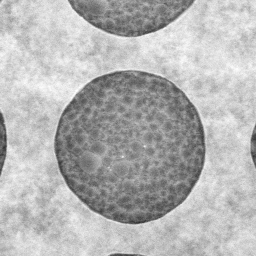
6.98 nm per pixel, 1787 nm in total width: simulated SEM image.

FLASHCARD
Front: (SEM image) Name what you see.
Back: holes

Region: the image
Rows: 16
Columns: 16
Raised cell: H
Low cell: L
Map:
HHHHHLLLLLLLHHHH
HHHHHHLLLLLHHHHH
HHHHHHHHHHHHHHHH
HHHHHHHHHHHHHHHH
HHHHHHHLLHHHHHHH
HHHHHLLLLLLHHHHH
HHHHLLLLLLLLHHHH
HHHHLLLLLLLLLHHH
HHHLLLLLLLLLLHHH
HHHLLLLLLLLLLHHH
HHHHLLLLLLLLLHHH
HHHHLLLLLLLLHHHH
HHHHHLLLLLLLHHHH
HHHHHHLLLLHHHHHH
HHHHHHHHHHHHHHHH
HHHHHHHHHHHHHHHH